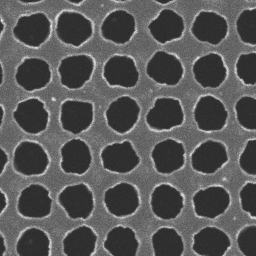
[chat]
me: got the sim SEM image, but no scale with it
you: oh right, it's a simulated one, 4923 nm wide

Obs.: a regular array of holes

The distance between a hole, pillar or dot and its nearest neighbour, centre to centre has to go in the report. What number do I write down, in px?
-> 42.5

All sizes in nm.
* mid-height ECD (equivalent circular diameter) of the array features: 651